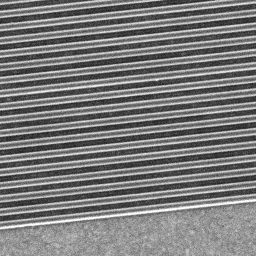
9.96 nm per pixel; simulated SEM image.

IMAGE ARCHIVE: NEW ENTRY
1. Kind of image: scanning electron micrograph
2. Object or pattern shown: parallel lines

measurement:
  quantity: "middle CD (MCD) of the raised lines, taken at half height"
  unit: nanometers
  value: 59.4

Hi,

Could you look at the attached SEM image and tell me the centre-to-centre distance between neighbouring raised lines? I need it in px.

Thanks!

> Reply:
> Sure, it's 13.1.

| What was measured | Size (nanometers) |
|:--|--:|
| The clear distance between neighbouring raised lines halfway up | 66.8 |